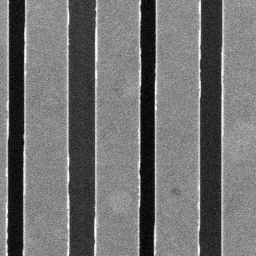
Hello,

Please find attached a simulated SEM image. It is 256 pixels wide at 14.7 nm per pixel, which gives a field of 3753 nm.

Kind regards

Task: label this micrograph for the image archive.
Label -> lines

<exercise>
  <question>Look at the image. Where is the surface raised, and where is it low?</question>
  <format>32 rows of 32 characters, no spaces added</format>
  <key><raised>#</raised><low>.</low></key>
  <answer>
#..#####....######..#####...####
#..######...######..#####...####
#..######...######..#####...####
#..######...######..#####...####
#..######...#####...#####...####
#..######...#####...#####...####
#..#####....######..#####...####
#..#####....######..#####...####
#..#####....######.######...####
#..#####....######.######...####
#..#####....######.######...####
#..#####....######.######...####
#..#####....######.######...####
#..#####....#####..######...####
#..#####....#####..######...####
#..#####....#####..######...####
#..#####....#####..######...####
#..#####....#####..######...####
#..#####....#####..######...####
#..######...#####..######...####
#..######...#####..######...####
#..######...#####..######...####
#..######...#####..######...####
#..#####....#####..######...####
#..######...#####..######...####
#..######...#####..######...####
#..######...#####..######...####
#..######...#####..######...####
#..######...#####..######...####
#..######...#####..######...####
#..######...#####..######...####
#..######...#####..######...####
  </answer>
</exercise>